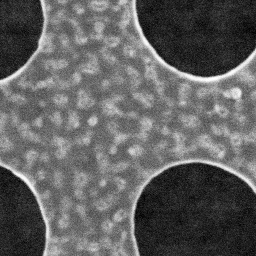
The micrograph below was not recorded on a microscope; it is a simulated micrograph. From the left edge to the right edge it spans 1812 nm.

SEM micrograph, holes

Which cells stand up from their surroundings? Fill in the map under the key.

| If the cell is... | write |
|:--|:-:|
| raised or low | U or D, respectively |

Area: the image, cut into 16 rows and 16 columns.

DDDUUUUUDDDDDDDD
DDDUUUUUUDDDDDDD
DDDUUUUUUDDDDDDD
DDUUUUUUUUDDDDDD
DUUUUUUUUUUDDDUU
UUUUUUUUUUUUUUUU
UUUUUUUUUUUUUUUU
UUUUUUUUUUUUUUUU
UUUUUUUUUUUUUUUU
UUUUUUUUUUUUUUUU
UUUUUUUUUUUDDDUU
DDUUUUUUUDDDDDDD
DDUUUUUUUDDDDDDD
DDDUUUUUDDDDDDDD
DDDUUUUUDDDDDDDD
DDDUUUUUUDDDDDDD